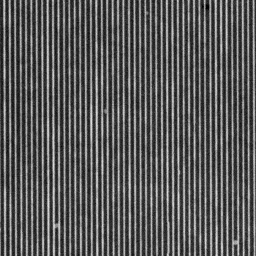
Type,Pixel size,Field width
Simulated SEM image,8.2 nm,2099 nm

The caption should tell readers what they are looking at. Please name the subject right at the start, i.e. parallel lines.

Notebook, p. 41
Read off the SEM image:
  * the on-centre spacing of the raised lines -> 44.4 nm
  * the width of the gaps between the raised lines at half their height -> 33.8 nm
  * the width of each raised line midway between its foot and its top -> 10.2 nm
